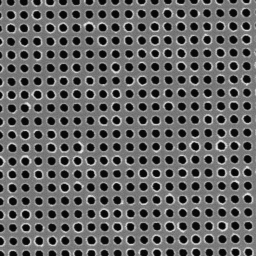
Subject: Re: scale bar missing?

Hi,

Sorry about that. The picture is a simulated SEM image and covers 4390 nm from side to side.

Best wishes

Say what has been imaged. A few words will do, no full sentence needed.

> a regular array of holes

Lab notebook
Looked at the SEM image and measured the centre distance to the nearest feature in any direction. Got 222 nanometres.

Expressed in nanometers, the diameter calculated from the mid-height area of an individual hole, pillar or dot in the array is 140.